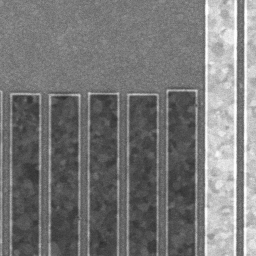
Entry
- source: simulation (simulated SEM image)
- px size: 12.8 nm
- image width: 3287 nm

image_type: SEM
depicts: parallel lines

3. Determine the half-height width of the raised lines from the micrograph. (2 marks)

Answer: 384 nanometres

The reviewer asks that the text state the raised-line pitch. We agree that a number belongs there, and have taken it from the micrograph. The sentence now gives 501 nm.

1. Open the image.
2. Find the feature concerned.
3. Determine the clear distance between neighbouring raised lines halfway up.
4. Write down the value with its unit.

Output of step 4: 0.123 microns